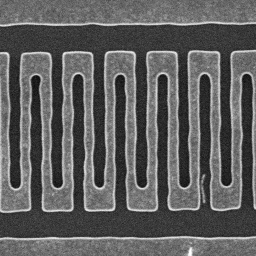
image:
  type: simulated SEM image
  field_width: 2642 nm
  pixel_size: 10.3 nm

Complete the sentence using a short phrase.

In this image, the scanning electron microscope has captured groups of lines, slits or small figures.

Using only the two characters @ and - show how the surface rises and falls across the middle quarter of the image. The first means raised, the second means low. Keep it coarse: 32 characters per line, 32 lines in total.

@@@@@@@---@@@@@@@@---@@@@@@@---@
@@@@@@@---@@@@@@@@---@@@@@@@---@
@@@-@@@---@@@@@@@@---@@@-@@@---@
@@---@@---@@@--@@@---@@---@@---@
@@---@@---@@---@@@---@@---@@---@
@@---@@---@@---@@@---@@---@@---@
@@---@@---@@---@@@---@@---@@---@
@@---@@---@@@--@@@---@@---@@---@
@@---@@----@@---@@---@@---@@---@
@@---@@----@@---@@---@@---@@---@
@@---@@----@@---@@---@@---@@---@
@@---@@----@----@@---@@---@@---@
@@---@@----@---@@@---@@---@@---@
@@---@@----@---@@@---@@---@@---@
@@---@@----@---@@@---@@---@@@--@
@@---@@----@---@@@---@@---@@@---
@@---@@----@---@@@---@@---@@----
@@---@@----@----@@---@@---@@---@
@@---@@@---@---@@@---@@---@@@--@
@@---@@@---@@--@@@---@@---@@@--@
@@---@@----@@--@@@---@@---@@---@
@@---@@----@@--@@@---@@---@@---@
@@----@----@---@@@---@@---@@----
@@---@@----@---@@@---@@---@@----
@@---@@----@----@@---@@---@@@---
@@---@@----@@---@@---@@---@@@---
@@---@@---@@@---@@---@@---@@@---
@@---@@---@@@---@@---@@---@@@---
@@---@@---@@@---@@---@@---@@@---
@@---@@@--@@@--@@@---@@---@@@---
@@---@@@--@@@---@@---@@---@@@--@
@@---@@@@@@@----@@@@@@@---@@@@@@